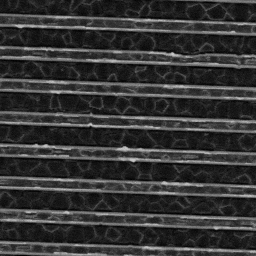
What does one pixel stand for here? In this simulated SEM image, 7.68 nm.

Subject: parallel lines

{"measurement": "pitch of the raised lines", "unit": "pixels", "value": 32.5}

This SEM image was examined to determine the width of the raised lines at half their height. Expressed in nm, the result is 83.5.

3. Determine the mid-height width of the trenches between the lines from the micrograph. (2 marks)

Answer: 161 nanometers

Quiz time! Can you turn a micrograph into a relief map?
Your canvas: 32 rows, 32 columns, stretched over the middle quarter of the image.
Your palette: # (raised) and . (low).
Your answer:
................................
................................
................................
................................
................................
##########################.###..
################################
............####################
................................
................................
................................
................................
................................
#####################...........
################################
.......#########################
................................
................................
................................
................................
................................
#####################...........
################################
...#############################
..............................##
................................
................................
................................
................................
################.........#......
################################
..##############################